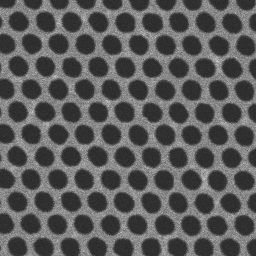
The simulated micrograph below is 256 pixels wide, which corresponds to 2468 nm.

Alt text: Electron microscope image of a regular array of holes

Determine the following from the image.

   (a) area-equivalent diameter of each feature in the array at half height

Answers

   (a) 0.201 microns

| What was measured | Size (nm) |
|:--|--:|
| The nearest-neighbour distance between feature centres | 249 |